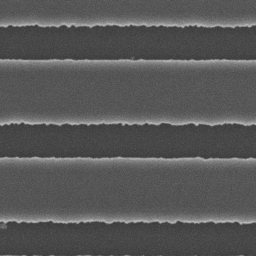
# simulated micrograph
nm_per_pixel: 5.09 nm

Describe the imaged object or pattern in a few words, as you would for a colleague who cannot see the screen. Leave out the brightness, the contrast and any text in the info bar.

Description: lines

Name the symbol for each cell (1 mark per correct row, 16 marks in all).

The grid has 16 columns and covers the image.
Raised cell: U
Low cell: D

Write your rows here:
UUUUUUUUUUUUUUUU
UUUUUUUUUUUUUUUU
DDDDDDDDDDDDDDDD
DDDDDDDDDDDDDDDD
UUUUUUUUUUUUUUUU
UUUUUUUUUUUUUUUU
UUUUUUUUUUUUUUUU
UUUUUUUUUUUUUUUU
DDDDDDDDDDDDDDDD
DDDDDDDDDDDDDDDD
UUUUUUUUUUUUUUUU
UUUUUUUUUUUUUUUU
UUUUUUUUUUUUUUUU
UUUUUUUUUUUUUUUU
DDDDDDDDDDDDDDDD
DDDDDDDDDDDDDDDD